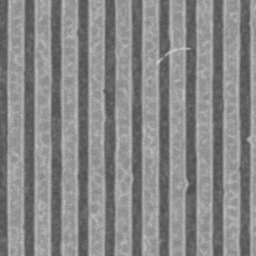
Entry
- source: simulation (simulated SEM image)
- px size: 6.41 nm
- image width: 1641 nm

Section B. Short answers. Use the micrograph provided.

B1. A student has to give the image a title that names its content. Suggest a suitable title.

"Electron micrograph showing parallel lines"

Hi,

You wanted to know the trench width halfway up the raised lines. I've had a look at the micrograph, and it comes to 77 nm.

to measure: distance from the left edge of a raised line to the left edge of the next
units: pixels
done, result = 27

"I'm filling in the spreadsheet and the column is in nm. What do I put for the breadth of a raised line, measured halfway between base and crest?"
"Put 93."